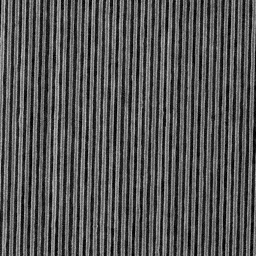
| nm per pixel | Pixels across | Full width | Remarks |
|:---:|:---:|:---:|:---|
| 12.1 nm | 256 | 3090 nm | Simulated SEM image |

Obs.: parallel lines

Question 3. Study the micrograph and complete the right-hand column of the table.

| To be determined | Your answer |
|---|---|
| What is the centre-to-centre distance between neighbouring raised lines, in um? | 0.0842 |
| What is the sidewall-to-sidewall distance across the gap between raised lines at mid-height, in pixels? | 3.88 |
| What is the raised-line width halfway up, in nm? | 36.2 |